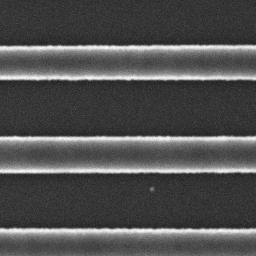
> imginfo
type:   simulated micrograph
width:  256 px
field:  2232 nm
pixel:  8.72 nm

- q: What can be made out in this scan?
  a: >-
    lines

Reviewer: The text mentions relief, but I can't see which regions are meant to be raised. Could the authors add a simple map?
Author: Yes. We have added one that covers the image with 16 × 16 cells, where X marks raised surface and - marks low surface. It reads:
----------------
----------------
----------------
XXXXXXXXXXXXXXXX
XXXXXXXXXXXXXXXX
----------------
----------------
----------------
----------------
XXXXXXXXXXXXXXXX
XXXXXXXXXXXXXXXX
----------------
----------------
----------------
XXXXXXXXXXXXXXXX
XXXXXXXXXXXXXXXX